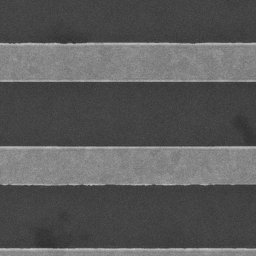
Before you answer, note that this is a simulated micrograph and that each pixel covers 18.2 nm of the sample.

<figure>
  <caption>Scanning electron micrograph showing lines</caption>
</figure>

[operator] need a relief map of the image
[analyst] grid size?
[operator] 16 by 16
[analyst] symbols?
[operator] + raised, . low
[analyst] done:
................
................
................
++++++++++++++++
++++++++++++++++
................
................
................
................
++++++++++++++++
++++++++++++++++
+++++++++++++...
................
................
................
................